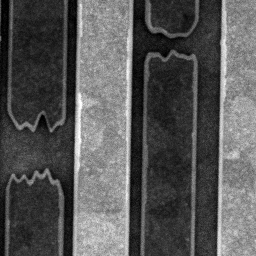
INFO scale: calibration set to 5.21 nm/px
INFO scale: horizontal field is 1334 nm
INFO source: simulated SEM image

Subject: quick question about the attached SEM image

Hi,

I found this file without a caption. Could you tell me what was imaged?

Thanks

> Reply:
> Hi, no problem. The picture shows one or a few lines or trenches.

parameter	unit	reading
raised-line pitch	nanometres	348